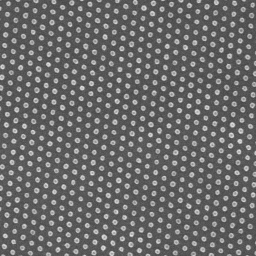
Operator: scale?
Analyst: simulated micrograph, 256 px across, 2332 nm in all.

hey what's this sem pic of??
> a regular array of raised bodies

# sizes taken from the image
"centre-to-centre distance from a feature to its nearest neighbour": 10.1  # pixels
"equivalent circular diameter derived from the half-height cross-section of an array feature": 41.1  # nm